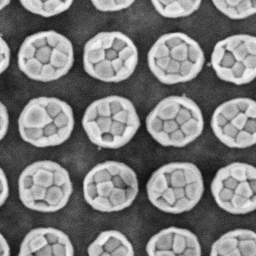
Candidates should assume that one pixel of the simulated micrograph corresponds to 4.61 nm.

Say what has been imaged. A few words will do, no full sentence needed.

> a regular array of raised bodies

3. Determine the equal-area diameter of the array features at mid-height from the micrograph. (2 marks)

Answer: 51.2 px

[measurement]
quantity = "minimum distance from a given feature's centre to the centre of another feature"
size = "64.6 pixels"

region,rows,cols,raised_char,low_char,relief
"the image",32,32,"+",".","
+..++++++...++++...++++++..+++++
....+++.............++++....++++
................................
................................
....++++....++++.....++......++.
+..++++++..++++++..++++++..+++++
+.+++++++..++++++..++++++..+++++
+.+++++++..++++++..++++++.++++++
+..+++++...++++++..++++++..+++++
....+++.....++++....++++....++++
................................
................................
....+++......+++.....++......++.
...++++++..++++++...+++++..+++++
+..++++++..++++++..++++++..+++++
+.+++++++.+++++++..++++++..+++++
+..++++++..++++++..++++++..+++++
...+++++...+++++....++++....++++
................................
................................
.....++......++..............+..
...+++++...+++++....+++++..+++++
+.+++++++..++++++..++++++..+++++
+.+++++++.+++++++..++++++.++++++
+..++++++..++++++..++++++..+++++
...+++++...+++++...+++++...+++++
................................
................................
................................
...+++++.....++....+++++....++++
+..++++++...++++...++++++..+++++
+..++++++..++++++..++++++.++++++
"